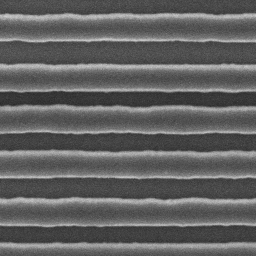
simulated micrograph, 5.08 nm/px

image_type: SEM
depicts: lines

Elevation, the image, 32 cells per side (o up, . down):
................................
................................
oooooooooooooooooooooooooooooooo
oooooooooooooooooooooooooooooooo
oooooooooooooooooooooooooooooooo
................................
................................
................................
oooooooooooooooooooooooooooooooo
oooooooooooooooooooooooooooooooo
oooooooooooooooooooooooooooooooo
..o......................o..oo..
................................
ooooooooooooooooooooooooooo.oooo
oooooooooooooooooooooooooooooooo
oooooooooooooooooooooooooooooooo
oooo..oooooooooooooooooooooooooo
................................
................................
oooooooooooooooooooooooooooooooo
oooooooooooooooooooooooooooooooo
oooooooooooooooooooooooooooooooo
................................
................................
................................
oooooooooooooooooooooooooooooooo
oooooooooooooooooooooooooooooooo
oooooooooooooooooooooooooooooooo
................................
................................
ooooo.oooooooooooooooo....o.oooo
oooooooooooooooooooooooooooooooo